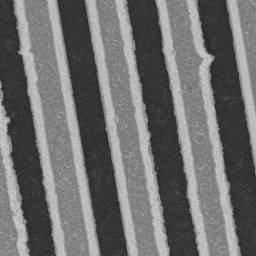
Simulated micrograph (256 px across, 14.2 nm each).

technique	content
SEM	one or a few lines or trenches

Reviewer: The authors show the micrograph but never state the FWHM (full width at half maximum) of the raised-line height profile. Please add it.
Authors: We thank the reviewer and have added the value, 422 nm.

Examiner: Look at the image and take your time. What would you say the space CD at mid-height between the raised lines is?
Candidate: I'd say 562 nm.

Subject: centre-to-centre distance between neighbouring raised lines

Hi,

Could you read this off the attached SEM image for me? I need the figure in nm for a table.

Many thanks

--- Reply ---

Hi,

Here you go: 989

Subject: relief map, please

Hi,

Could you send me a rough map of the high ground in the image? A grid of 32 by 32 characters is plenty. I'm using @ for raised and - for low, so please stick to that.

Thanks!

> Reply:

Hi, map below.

--@@@@-----@@@@-----@@@@-----@@@
---@@@@-----@@@-----@@@@-----@@@
---@@@@-----@@@------@@@-----@@@
---@@@@-----@@@@-----@@@------@@
---@@@@-----@@@@-----@@@@-----@@
---@@@@-----@@@@-----@@@@-----@@
---@@@@-----@@@@-----@@@@-----@@
----@@@@-----@@@-----@@@@@----@@
----@@@@-----@@@------@@@-----@@
----@@@@-----@@@@-----@@@@-----@
----@@@@-----@@@@-----@@@@-----@
----@@@@-----@@@@-----@@@@-----@
----@@@@@----@@@@-----@@@@-----@
-----@@@@-----@@@------@@@-----@
-----@@@@-----@@@------@@@-----@
@----@@@@-----@@@@-----@@@@-----
-----@@@@-----@@@@-----@@@@-----
-----@@@@-----@@@@-----@@@@-----
@----@@@@@----@@@@-----@@@@-----
@-----@@@@-----@@@-----@@@@-----
@-----@@@@-----@@@------@@@-----
@-----@@@@-----@@@@-----@@@-----
@-----@@@@-----@@@@-----@@@@----
@-----@@@@-----@@@@-----@@@@----
@@-----@@@@----@@@@-----@@@@----
@@-----@@@@-----@@@-----@@@@----
@@-----@@@@-----@@@------@@@----
@@-----@@@@-----@@@@-----@@@----
@@@----@@@@-----@@@@-----@@@@---
@@@----@@@@-----@@@@-----@@@@---
@@@-----@@@@----@@@@-----@@@@---
@@@-----@@@@-----@@@-----@@@@---